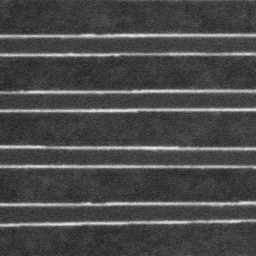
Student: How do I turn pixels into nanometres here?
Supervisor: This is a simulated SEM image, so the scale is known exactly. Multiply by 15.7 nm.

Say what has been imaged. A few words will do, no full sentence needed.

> lines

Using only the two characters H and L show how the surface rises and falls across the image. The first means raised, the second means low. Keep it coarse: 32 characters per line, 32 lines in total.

LLLLLLLLLLLLLLLLLLLLLLLLLLLLLLLL
LLLLLLLLLLLLLLLLLLLLLLLLLLLLLLLL
LLLLLLLLLLLLLLLLLLLLLLLLLLLLLLLL
LLLLLLLLLLLLLLLLLLLLLLLLLLLLLLLL
LLLLLLLLLLLLLLLLHHHHHHHHHHHHHHHH
HHHHHHHHHHHHHHHHHHHHHHHHHHHHHHHH
HHHHHHHHHHHHHHHHHHHHHHHHHHHHHHHH
LLLLLLLLLLLLLLLLLLLLLLLLLLLLLLLL
LLLLLLLLLLLLLLLLLLLLLLLLLLLLLLLL
LLLLLLLLLLLLLLLLLLLLLLLLLLLLLLLL
LLLLLLLLLLLLLLLLLLLLLLLLLLLLLLLL
LLLHHHHHHHHHHHHHHHHHHHHHHHHHHHHH
HHHHHHHHHHHHHHHHHHHHHHHHHHHHHHHH
HHHHHHHHHHHHHHHHHHHHHHHHHHHHHHHH
LLLLLLLLLLLLLLLLLLLLLLLLLLLLLLLL
LLLLLLLLLLLLLLLLLLLLLLLLLLLLLLLL
LLLLLLLLLLLLLLLLLLLLLLLLLLLLLLLL
LLLLLLLLLLLLLLLLLLLLLLLLLLLLLLLL
HHHHHHHHHHHHHHHHHHLLLLLLLLLLLLLL
HHHHHHHHHHHHHHHHHHHHHHHHHHHHHHHH
HHHHHHHHHHHHHHHHHHHHHHHHHHHHHHHH
LLLLLLLLLLLLLLLLLLLLLLLLLLLLLLLL
LLLLLLLLLLLLLLLLLLLLLLLLLLLLLLLL
LLLLLLLLLLLLLLLLLLLLLLLLLLLLLLLL
LLLLLLLLLLLLLLLLLLLLLLLLLLLLLLLL
LLLLLLLLLLLLLLLHHHHHHHHHHHHHHHHH
HHHHHHHHHHHHHHHHHHHHHHHHHHHHHHHH
HHHHHHHHHHHHHHHHHHHHHHHHHHHHHHHH
LLLLLLLLLLLLLLLLLLLLLLLLLLLLLLLL
LLLLLLLLLLLLLLLLLLLLLLLLLLLLLLLL
LLLLLLLLLLLLLLLLLLLLLLLLLLLLLLLL
LLLLLLLLLLLLLLLLLLLLLLLLLLLLLLLL